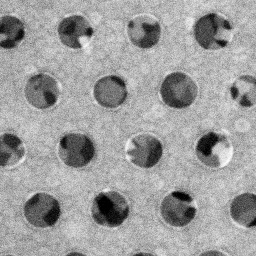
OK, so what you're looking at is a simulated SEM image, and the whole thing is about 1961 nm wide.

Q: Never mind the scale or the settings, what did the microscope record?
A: a regular array of raised bodies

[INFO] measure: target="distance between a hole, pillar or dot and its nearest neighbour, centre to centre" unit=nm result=520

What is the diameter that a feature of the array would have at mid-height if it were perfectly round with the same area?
292 nanometres